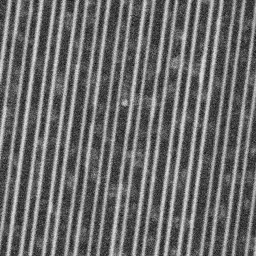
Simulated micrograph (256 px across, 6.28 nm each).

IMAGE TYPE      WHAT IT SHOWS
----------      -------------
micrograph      parallel lines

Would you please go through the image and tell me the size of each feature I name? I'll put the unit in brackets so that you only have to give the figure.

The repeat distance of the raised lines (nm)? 70.1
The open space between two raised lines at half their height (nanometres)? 43.6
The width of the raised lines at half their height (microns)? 0.0163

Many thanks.